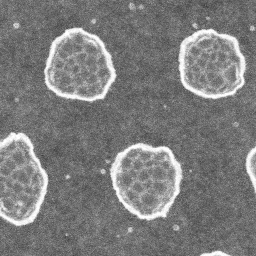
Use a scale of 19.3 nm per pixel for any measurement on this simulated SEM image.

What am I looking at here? raised bodies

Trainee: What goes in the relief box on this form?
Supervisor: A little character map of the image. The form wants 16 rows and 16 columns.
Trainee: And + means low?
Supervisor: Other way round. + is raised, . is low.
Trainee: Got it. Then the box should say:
................
................
....++......++..
...++++....++++.
...++++....++++.
...++++.....+++.
................
................
................
++......++......
+++....++++.....
+++....++++.....
+++.....+++.....
++..............
................
................